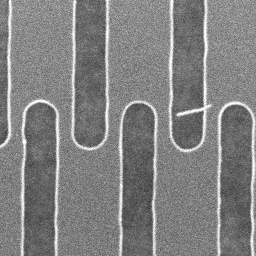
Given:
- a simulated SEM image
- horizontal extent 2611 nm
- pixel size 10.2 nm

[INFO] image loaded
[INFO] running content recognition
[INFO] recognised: groups of lines, slits or small figures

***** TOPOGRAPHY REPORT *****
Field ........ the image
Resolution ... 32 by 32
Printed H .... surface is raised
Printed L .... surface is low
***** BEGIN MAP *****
LHHHHHHHHLLLLHHHHHHHHHLLLLHHHHHH
LHHHHHHHHLLLLHHHHHHHHLLLLLHHHHHH
LHHHHHHHHLLLLHHHHHHHHHLLLLHHHHHH
LHHHHHHHHLLLLHHHHHHHHHLLLLHHHHHH
LHHHHHHHHLLLLHHHHHHHHLLLLLHHHHHH
LHHHHHHHHLLLLHHHHHHHHLLLLLHHHHHH
LHHHHHHHHLLLLHHHHHHHHLLLLLHHHHHH
LHHHHHHHHLLLLHHHHHHHHLLLLLHHHHHH
LHHHHHHHHLLLLHHHHHHHHLLLLLHHHHHH
LHHHHHHHHLLLLHHHHHHHHLLLLLHHHHHH
LHHHHHHHHLLLLHHHHHHHHLLLLLHHHHHH
LHHHHHHHHLLLLHHHHHHHHLLLLLHHHHHH
LHHHHHHHHLLLLHHHHHHHHLLLLLHHHHHH
LHHHLLLHHLLLLHHHLLLHHLLLLHHHLLLH
LHHLLLLHHLLLLHHLLLLHHLLLLLHHLLLH
LHHLLLLHHLLLLHHLLLLHHLLLLLHHLLLL
LHHLLLLHHLLLLHHLLLLHHLLLLHHHLLLL
LHHLLLLHHLLLLHHLLLLHHHLLLHHHLLLL
HHHLLLLHHHHHHHHLLLLHHHHLHHHHLLLL
HHHLLLLHHHHHHHHLLLLHHHHHHHHHLLLL
HHHLLLLHHHHHHHHLLLLHHHHHHHHHLLLL
HHHLLLLHHHHHHHHLLLLHHHHHHHHLLLLL
HHHLLLLHHHHHHHHLLLLHHHHHHHHLLLLL
HHHLLLLHHHHHHHHLLLLHHHHHHHHLLLLH
HHHLLLLHHHHHHHHLLLLHHHHHHHHLLLLL
HHHLLLLHHHHHHHHLLLLHHHHHHHHLLLLH
HHHLLLLHHHHHHHHLLLLHHHHHHHHLLLLH
HHHLLLLHHHHHHHHLLLLHHHHHHHHLLLLH
HHHLLLLHHHHHHHHLLLLHHHHHHHHLLLLL
HHHLLLLHHHHHHHHLLLLHHHHHHHHLLLLH
HHHLLLLHHHHHHHHLLLLHHHHHHHHLLLLH
HHHLLLLHHHHHHHHLLLLHHHHHHHHLLLLL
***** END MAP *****